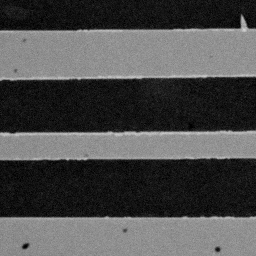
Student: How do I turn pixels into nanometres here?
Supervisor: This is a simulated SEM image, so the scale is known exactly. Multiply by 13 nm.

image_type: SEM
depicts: lines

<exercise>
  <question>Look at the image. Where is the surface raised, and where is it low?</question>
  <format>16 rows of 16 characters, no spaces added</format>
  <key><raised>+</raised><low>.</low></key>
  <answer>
................
................
++++++++++++++++
++++++++++++++++
++++++++++++++++
................
................
................
++++++++++++++++
++++++++++++++++
................
................
................
................
++++++++++++++++
++++++++++++++++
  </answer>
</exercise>